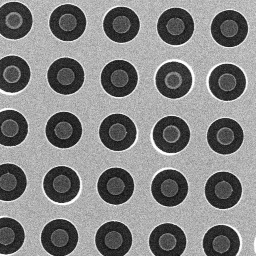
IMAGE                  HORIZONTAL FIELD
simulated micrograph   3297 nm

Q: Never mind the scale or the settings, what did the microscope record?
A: an array of small figures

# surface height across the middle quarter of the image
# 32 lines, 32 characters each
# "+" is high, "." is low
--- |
....++++++.......+++++++.......+
++...+++++........+++++.........
++...++++...++++..+++++.........
++...++++...++++...++++...+++...
++...++++...++++...++++...+++...
....+++++.....+...+++++...++....
....++++++........+++++.........
..+++++++++.....++++++++.......+
++++++++++++++++++++++++++...+++
++++++++++++++++++++++++++++++++
++++++++++++++++++++++++++++++++
++++++++++++++++++++++++++++++++
..++++++++++...+++++++++++++++++
....++++++......+++++++++....+++
....++++++.......++++++.......++
++...++++...+++...++++.........+
++...++++..++++...++++...+++....
++..+++++..++++...++++...++++...
+...+++++...+++...++++...+++...+
....+++++.........++++.........+
..++++++++.......++++++........+
++++++++++++...+++++++++......++
++++++++++++++++++++++++++..++++
++++++++++++++++++++++++++++++++
++++++++++++++++++++++++++++++++
++++++++++++++++++++++++++++++++
..+++++++++....+++++++++....++++
...++++++........++++++.......++
+...+++++...++...+++++........++
+...++++...++++..+++++...+++...+
+...++++...++++...++++..++++...+
+...++++...++++...++++..++++...+